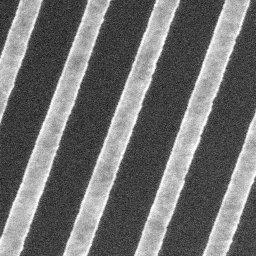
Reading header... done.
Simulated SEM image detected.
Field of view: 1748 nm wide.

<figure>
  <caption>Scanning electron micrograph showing lines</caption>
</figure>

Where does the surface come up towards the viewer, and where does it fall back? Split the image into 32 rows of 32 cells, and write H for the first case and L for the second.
LLHHHLLLLLLHHHLLLLLHHHLLLLLLHHHL
LLHHHLLLLLLHHLLLLLLHHHLLLLLLHHHL
LLHHLLLLLLHHHLLLLLLHHLLLLLLHHHLL
LHHHLLLLLLHHLLLLLLHHHLLLLLLHHHLL
LHHHLLLLLLHHLLLLLLHHHLLLLLLHHHLL
LHHLLLLLLHHHLLLLLLHHLLLLLLHHHLLL
HHHLLLLLLHHLLLLLLHHHLLLLLLHHHLLL
HHHLLLLLHHHLLLLLLHHHLLLLLLHHHLLL
HHLLLLLLHHHLLLLLLHHLLLLLLHHHLLLL
HHLLLLLLHHLLLLLLHHHLLLLLLHHHLLLL
HHLLLLLHHHLLLLLLHHHLLLLLLHHLLLLL
HLLLLLLHHHLLLLLHHHLLLLLLHHHLLLLL
HLLLLLLHHLLLLLLHHHLLLLLLHHHLLLLL
HLLLLLHHHLLLLLLHHLLLLLLHHHLLLLLL
LLLLLLHHHLLLLLHHHLLLLLLHHHLLLLLL
LLLLLHHHLLLLLLHHHLLLLLLHHHLLLLLH
LLLLLHHHLLLLLLHHLLLLLLHHHLLLLLLH
LLLLLHHHLLLLLHHHLLLLLLHHHLLLLLLH
LLLLHHHLLLLLLHHHLLLLLLHHLLLLLLHH
LLLLHHHLLLLLHHHLLLLLLHHHLLLLLLHH
LLLLHHLLLLLLHHHLLLLLLHHHLLLLLLHH
LLLHHHLLLLLLHHLLLLLLLHHLLLLLLHHH
LLLHHHLLLLLHHHLLLLLLHHHLLLLLLHHH
LLLHHLLLLLLHHHLLLLLLHHHLLLLLLHHL
LLHHHLLLLLLHHHLLLLLHHHLLLLLLHHHL
LLHHHLLLLLHHHLLLLLLHHHLLLLLLHHHL
LHHHLLLLLLHHHLLLLLLHHHLLLLLHHHLL
LHHHLLLLLLHHLLLLLLHHHLLLLLLHHHLL
LHHHLLLLLHHHLLLLLLHHHLLLLLLHHLLL
HHHLLLLLLHHHLLLLLLHHLLLLLLHHHLLL
HHHLLLLLHHHLLLLLLHHHLLLLLLHHHLLL
HHHLLLLLHHHLLLLLLHHHLLLLLLHHLLLL